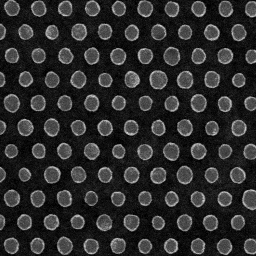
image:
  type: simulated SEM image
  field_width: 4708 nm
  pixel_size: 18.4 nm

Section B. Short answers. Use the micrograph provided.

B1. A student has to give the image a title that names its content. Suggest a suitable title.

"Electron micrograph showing a regular array of raised bodies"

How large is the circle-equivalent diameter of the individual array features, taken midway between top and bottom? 0.271 um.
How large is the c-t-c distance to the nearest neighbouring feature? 486 nanometers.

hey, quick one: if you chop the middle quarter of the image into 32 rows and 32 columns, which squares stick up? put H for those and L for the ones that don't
LLLLLLLLLLLLLLLLLLLLLLLLLLLLLLLL
LLLLLLLLLLLLLLLLLLLLLLLLLLLLLLLL
LLHHHLLLLHHLLLLLHHLLLLHHHLLLLHHH
LLHHHLLLLHHHLLLHHHHLLLHHHHLLLHHH
LLHHHLLLLHHHLLLHHHHLLLHHHHLLLHHH
LLLHHLLLLLHLLLLLHHLLLLHHHLLLLHHH
LLLLLLLLLLLLLLLLLLLLLLLLLLLLLLLL
LLLLLLLLLLLLLLLLLLLLLLLLLLLLLLLL
HHLLLLHHLLLLLHHLLLLHHLLLLLHHLLLL
HHLLLHHHHLLLHHHLLLLHHHLLLHHHLLLL
HHLLLHHHLLLLHHHLLLLHHHLLLHHHLLLL
HLLLLLHHLLLLLLLLLLLHHLLLLLHHLLLL
LLLLLLLLLLLLLLLLLLLLLLLLLLLLLLLL
LLLLLLLLLLLLLLLLLLLLLLLLLLLLLLLL
LLLHLLLLLHHLLLLLHHLLLLLHHLLLLHHH
LLHHHLLLHHHHLLLHHHLLLLHHHLLLHHHH
LLHHHLLLHHHHLLLHHHLLLLHHHLLLHHHH
LLLHHLLLLHHLLLLLHLLLLLLHHLLLLHHL
LLLLLLLLLLLLLLLLLLLLLLLLLLLLLLLL
LLLLLLLLLLLLLLLLLLLLLLLLLLLLLLLL
HLLLLLHHLLLLLHHLLLLHHLLLLHHHLLLL
HHLLLHHHHLLLHHHLLLLHHHLLLHHHHLLL
HHLLLHHHHLLLHHHLLLLHHHLLLHHHHLLL
HLLLLLHHLLLLLLLLLLLHHLLLLLHHLLLL
LLLLLLLLLLLLLLLLLLLLLLLLLLLLLLLL
LLLLLLLLLLLLLLLLLLLLLLLLLLLLLLLL
LLHHHLLLLHHHLLLLHHLLLLHHHLLLLHHL
LLHHHLLLLHHHLLLHHHHLLLHHHLLLHHHH
LLHHHLLLLHHHLLLHHHHLLLHHHLLLHHHH
LLLLLLLLLLHLLLLLHHLLLLHHHLLLLHHL
LLLLLLLLLLLLLLLLLLLLLLLLLLLLLLLL
LLLLLLLLLLLLLLLLLLLLLLLLLLLLLLLL